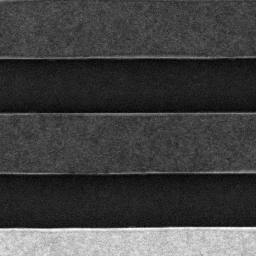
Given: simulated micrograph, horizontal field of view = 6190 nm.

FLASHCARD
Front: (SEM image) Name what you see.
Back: wiring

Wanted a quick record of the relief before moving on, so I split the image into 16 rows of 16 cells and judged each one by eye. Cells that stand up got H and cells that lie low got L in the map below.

HHHHHHHHHHHHHHHH
HHHHHHHHHHHHHHHH
HHHHHHHHHHHHHHHH
HHHHHHHHHHHHHHHH
LLLLLLLLLLLLLLLL
LLLLLLLLLLLLLLLL
LLLLLLLLLLLLLLLL
HHHHHHHHHHHHHHHH
HHHHHHHHHHHHHHHH
HHHHHHHHHHHHHHHH
HHHHHHHHHHHHHHHH
LLLLLLLLLLLLLLLL
LLLLLLLLLLLLLLLL
LLLLLLLLLLLLLLLL
HHHHHHHHHHHHHHHH
HHHHHHHHHHHHHHHH